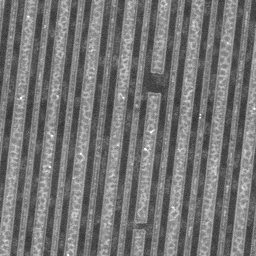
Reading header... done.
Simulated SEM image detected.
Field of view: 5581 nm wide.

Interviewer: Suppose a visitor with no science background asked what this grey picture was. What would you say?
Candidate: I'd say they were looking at parallel lines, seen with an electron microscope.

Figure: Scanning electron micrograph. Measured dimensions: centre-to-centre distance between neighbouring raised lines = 0.36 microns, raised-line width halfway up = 173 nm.